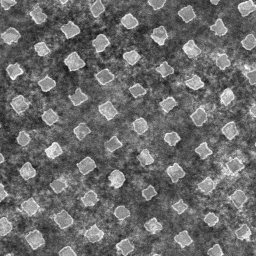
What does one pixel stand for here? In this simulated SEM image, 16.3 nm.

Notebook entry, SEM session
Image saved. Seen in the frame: a regular array of raised bodies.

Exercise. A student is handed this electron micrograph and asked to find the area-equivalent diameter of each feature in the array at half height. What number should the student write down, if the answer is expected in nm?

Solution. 236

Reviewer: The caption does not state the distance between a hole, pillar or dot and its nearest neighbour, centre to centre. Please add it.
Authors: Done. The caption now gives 0.54 µm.